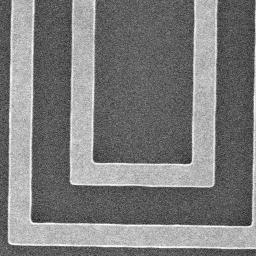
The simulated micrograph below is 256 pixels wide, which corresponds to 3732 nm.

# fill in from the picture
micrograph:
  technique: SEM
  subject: groups of lines, slits or small figures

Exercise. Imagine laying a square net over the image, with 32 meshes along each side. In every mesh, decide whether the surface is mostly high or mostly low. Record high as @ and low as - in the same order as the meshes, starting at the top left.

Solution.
--@@-----@@@------------@@@-----
-@@@-----@@@------------@@@-----
-@@@-----@@@------------@@@-----
-@@@-----@@@------------@@@-----
-@@@-----@@@------------@@@-----
-@@@-----@@@------------@@@-----
-@@@-----@@@------------@@@-----
-@@@-----@@@------------@@@-----
-@@@-----@@@------------@@@-----
-@@@-----@@@------------@@@-----
-@@@-----@@@------------@@@-----
-@@@-----@@@------------@@@-----
-@@@-----@@@------------@@@-----
-@@@-----@@@------------@@@-----
-@@@-----@@@------------@@@-----
-@@@-----@@@------------@@@-----
-@@@-----@@@------------@@@-----
-@@@-----@@@------------@@@-----
-@@@-----@@-------------@@@-----
-@@@-----@@-------------@@@-----
-@@@-----@@@@@@@--------@@@-----
-@@@-----@@@@@@@@@@@@@@@@@@-----
-@@@-----@@@@@@@@@@@@@@@@@@-----
-@@@----------------------------
-@@@----------------------------
-@@@----------------------------
-@@@----------------------------
-@@@----------------------------
-@@@@@@@@@@@@@@@@@@@@@@@@@@@@@@@
-@@@@@@@@@@@@@@@@@@@@@@@@@@@@@@@
-@@@@@@@@@@@@@@@@@@@@@@@@@@@@@@@
--------------------------------